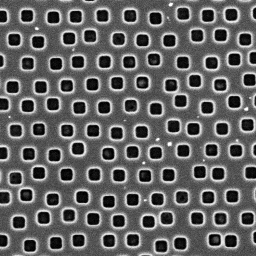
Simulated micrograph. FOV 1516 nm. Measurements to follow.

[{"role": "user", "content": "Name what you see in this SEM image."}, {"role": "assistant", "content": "a regular array of holes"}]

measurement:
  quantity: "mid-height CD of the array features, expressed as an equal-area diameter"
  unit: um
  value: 0.0787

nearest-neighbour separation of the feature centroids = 134 nm